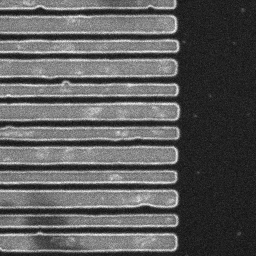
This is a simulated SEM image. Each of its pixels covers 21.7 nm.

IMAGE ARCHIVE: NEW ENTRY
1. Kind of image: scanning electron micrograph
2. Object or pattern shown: parallel lines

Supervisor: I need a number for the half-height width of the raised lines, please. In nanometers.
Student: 201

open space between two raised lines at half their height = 323 nanometers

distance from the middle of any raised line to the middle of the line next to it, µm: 0.474